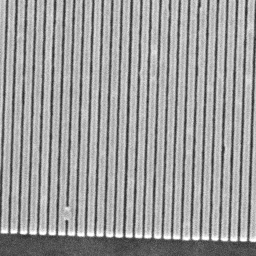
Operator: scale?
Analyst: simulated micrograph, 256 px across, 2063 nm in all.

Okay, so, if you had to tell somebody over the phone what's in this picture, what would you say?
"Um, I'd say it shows parallel lines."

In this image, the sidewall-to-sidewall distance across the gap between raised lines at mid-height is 27.2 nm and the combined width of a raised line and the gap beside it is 77.1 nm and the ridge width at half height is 48.3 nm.